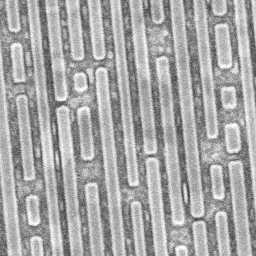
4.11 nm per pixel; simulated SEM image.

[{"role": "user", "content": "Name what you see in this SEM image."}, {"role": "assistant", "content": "parallel lines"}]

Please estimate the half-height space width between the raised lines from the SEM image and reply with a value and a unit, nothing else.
0.0424 um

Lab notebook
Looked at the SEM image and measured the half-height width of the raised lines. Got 10.3 px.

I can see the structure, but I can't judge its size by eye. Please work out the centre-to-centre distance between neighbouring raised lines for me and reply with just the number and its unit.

0.085 µm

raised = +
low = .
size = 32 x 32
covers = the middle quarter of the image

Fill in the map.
.............++...+++..+++..+++.
........++....++..+++...++..+++.
...++.+.+++...++..+++...++...++.
...++.+.+++...++...++...++...++.
...++...+++...++...++...++...++.
...+++..+++...++...++...++...+++
...++...+++...++...++...++...+++
+........++...++...+++..+++..+++
.........++...++...+++..+++..+++
.........++...++...+++..+++..+++
.........++...++...+++..+++..+++
+...++...+++...++..+++...++..+++
+...++...+++...++..+++...++...++
+...++...+++...++...++...++...++
+...++...+++...++...++...++...++
+...+++..+++...++...++...++...++
+...+++..+++...++...++...++...++
++..+++...++...++...+++..+++..++
++..+++...++...++...+++..+++..++
++..+++...++...++...+++..+++..++
++..+++...++....+...+++..+++..++
++..+++...+++...++..+++...++...+
++...++...+++...++........++...+
++...++...+++...++........++...+
++........+++...++...++...++...+
++........+++...++...++...++...+
++........+++...++...+++..++...+
+++........++...++...+++..+++..+
+++........++...++...+++..+++..+
+++........++...++...+++..+++..+
+++...++...+++.......+++..+++..+
+++...++...+++.......+++...++.+.